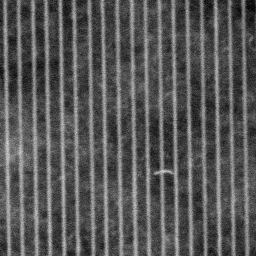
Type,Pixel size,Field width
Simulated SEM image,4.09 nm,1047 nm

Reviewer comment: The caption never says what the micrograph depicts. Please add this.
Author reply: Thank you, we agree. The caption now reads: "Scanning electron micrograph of parallel lines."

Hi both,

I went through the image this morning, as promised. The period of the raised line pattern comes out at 57.3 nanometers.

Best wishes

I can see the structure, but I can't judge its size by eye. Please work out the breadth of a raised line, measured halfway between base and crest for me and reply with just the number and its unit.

9.7 nm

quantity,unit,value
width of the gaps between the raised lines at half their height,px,11.4